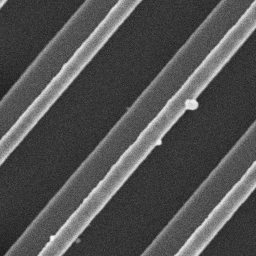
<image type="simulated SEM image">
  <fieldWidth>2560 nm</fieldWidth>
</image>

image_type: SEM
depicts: lines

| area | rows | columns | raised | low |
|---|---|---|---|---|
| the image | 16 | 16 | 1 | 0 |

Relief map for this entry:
0000011100000111
0000111100000111
0001111000001110
0011110000011100
0011100000111100
0111000001111000
1110000011110000
1100000011100000
1100000111000001
1000001110000011
0000011100000111
0000111100000111
0001111000001110
0011110000011100
0011100000111100
0111000001111000